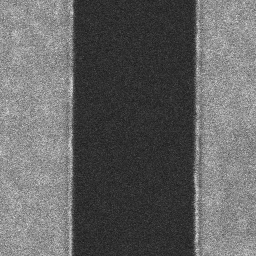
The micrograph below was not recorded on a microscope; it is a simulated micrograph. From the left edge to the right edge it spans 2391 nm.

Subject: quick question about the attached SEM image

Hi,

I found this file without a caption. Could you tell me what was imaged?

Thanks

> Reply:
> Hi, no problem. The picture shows one or a few lines or trenches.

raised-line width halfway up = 130 pixels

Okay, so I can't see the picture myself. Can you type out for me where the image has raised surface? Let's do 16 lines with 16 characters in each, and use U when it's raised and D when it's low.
DDDDUUUUUUUUDDDD
DDDDUUUUUUUUDDDD
DDDDUUUUUUUUDDDD
DDDDUUUUUUUUDDDD
DDDDUUUUUUUUDDDD
DDDDUUUUUUUUDDDD
DDDDUUUUUUUUDDDD
DDDDUUUUUUUUDDDD
DDDDUUUUUUUUDDDD
DDDDUUUUUUUUDDDD
DDDDUUUUUUUUDDDD
DDDDUUUUUUUUDDDD
DDDDUUUUUUUUDDDD
DDDDUUUUUUUUDDDD
DDDDUUUUUUUUDDDD
DDDDUUUUUUUUDDDD